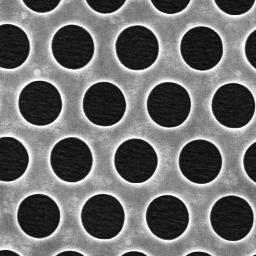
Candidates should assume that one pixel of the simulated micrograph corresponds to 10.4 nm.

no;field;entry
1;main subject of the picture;a regular array of holes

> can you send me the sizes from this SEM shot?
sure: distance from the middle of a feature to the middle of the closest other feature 64.3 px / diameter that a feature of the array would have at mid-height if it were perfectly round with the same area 0.459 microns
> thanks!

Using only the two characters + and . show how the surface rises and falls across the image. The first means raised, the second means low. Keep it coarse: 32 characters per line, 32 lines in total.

+++....++++....++++.....+++.....
+++++.++++++..++++++..++++++...+
++++++++++++++++++++++++++++++++
..++++++..++++++..++++++..++++++
...++++....++++....++++....++++.
....++......+++.....+++.....+++.
....+++.....++......+++.....+++.
...++++....++++....++++.....+++.
..++++++..++++++..++++++..++++++
++++++++++++++++++++++++++++++++
++++..++++++..++++++..++++++..++
+++....++++....++++....++++....+
++......++......++......++......
++......++......++......++......
+++....++++....++++....++++.....
++++..++++++..++++++...+++++...+
++++++++++++++++++++++++++++++++
..++++++..++++++..++++++..++++++
...++++....++++....++++....++++.
....++.....+++......++......++..
...+++.....+++......++......++..
...++++....++++....++++....++++.
..++++++..++++++..++++++...+++++
++++++++++++++++++++++++++++++++
++++..++++++..++++++..++++++++++
+++....++++....++++....++++....+
++.....+++.....+++.....+++......
++.....+++......++......++......
+++....++++....++++....++++....+
++++..++++++..++++++..+++++....+
++++++++++++++++++++++++++++++++
..++++++..++++++.+++++++..++++++